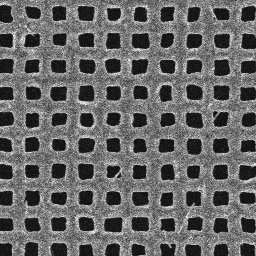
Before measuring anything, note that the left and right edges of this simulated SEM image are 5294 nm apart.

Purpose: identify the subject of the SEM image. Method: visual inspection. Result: a regular array of holes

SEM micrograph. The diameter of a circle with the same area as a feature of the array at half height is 0.321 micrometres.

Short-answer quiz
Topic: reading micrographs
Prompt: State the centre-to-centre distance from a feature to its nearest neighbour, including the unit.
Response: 537 nanometers